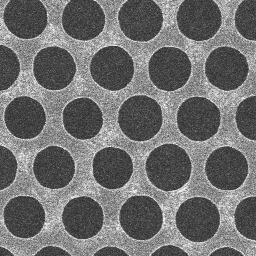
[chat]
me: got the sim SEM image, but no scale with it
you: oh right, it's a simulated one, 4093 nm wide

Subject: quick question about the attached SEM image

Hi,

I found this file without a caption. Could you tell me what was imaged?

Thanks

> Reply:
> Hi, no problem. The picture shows a regular array of holes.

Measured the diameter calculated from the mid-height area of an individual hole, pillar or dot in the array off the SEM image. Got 703 nanometers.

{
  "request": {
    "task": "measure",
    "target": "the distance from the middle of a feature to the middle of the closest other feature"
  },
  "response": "910 nm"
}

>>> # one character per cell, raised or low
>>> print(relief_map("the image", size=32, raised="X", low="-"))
X----XXX----XXX-----XXX----XXX--
X-----XX-----XX-----XX------X---
------XX-----XX-----XX------X---
X-----XX-----XX-----XX-----XX---
XX---XXXX---XXXX---XXXX----XXX--
XXXXXXXXXXXXXXXXXXXXXXXXXXXXXXXX
--XXX---XXXX----XXX----XXX----XX
--XX-----XX------XX-----XX-----X
---X------X------XX-----XX-----X
--XX-----XX------XX-----XX-----X
--XXX----XXX----XXX----XXX----XX
XXXXXXXXXXXXXXXXXXXXXXXXXXXXXXXX
XX--XXXXX--XXXXX---XXXX---XXXX--
X----XXX----XXX-----XX-----XXX--
------XX-----XX-----XX------X---
X-----XX-----XX-----XX------XX--
X----XXX----XXX-----XXX----XXX--
XXXXXXXXXXXXXXXXX--XXXXX--XXXXXX
-XXXXX--XXXXX--XXXXX---XXXX--XXX
--XX-----XXX----XXX-----XX-----X
--XX-----XXX-----X------XX-----X
--XX-----XXX-----X------XX-----X
--XXX----XXX----XXX-----XX-----X
-XXXXX--XXXXX--XXXXX--XXXXX---XX
XXXXXXXXXX-XXXXXX-XXXXXXXXXXXXXX
X----XXX----XXX-----XXX----XXX--
------XX-----XX-----XX-----XX---
X-----XX-----XX-----XX-----XX---
X----XXX-----XX-----XX-----XXX--
XX--XXXXX---XXXX---XXXX----XXX--
XXXXXXXXXXXXXXXXXXXXXXXXXXXXXXXX
-XXXX---XXXX----XXX----XXXX---XX